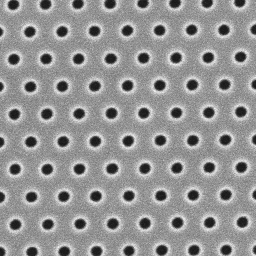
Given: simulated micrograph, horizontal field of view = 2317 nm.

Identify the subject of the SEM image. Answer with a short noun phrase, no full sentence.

a regular array of holes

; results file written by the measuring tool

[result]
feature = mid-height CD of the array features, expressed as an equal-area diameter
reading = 106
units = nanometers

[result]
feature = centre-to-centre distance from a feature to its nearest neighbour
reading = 287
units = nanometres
